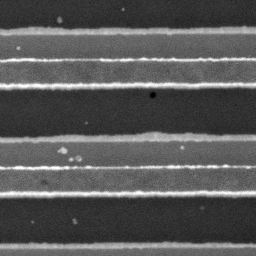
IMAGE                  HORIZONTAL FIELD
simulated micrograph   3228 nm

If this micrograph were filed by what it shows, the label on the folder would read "lines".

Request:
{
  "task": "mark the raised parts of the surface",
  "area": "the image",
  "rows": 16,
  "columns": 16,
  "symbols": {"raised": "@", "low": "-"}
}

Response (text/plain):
----------------
----------------
@@@@@@@@@@@@@@@@
@@@@@@@@@@@@@@@@
@@@@@@@@@@@@@@@@
----------------
----------------
----------------
----------------
@@@@@@@@@@@@@@@@
@@@@@@@@@@@@@@@@
@@@@@@@@@@@@@@@@
----------------
----------------
----------------
@@@@@@@@@@@@@@@@